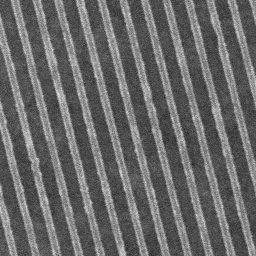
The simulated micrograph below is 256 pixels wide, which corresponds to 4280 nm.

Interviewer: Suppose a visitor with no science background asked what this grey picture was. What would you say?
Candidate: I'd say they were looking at parallel lines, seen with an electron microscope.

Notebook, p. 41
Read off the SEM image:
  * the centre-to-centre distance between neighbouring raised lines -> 352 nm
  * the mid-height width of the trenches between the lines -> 237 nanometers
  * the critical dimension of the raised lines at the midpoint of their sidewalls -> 112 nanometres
